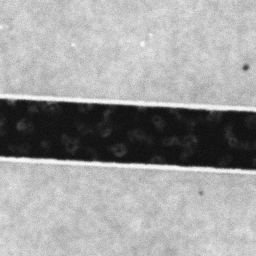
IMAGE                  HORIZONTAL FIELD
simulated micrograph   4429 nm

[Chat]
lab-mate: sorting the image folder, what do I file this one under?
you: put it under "one or a few lines or trenches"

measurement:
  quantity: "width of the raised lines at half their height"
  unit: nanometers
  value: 1090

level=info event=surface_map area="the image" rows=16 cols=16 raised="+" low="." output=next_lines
................
................
................
................
................
................
+++++++++.......
++++++++++++++++
++++++++++++++++
++++++++++++++++
..........++++++
................
................
................
................
................